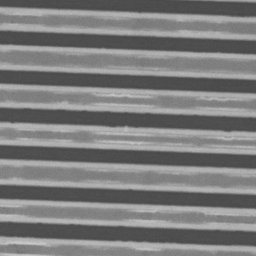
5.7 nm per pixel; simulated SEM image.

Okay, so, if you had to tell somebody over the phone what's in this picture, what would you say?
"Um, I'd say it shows parallel lines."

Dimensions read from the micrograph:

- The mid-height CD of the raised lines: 103 nm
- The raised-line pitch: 218 nanometres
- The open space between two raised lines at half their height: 19 pixels